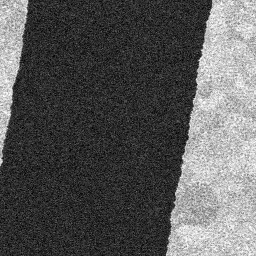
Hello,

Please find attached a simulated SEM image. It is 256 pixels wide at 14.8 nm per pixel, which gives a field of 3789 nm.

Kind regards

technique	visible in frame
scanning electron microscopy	one or a few lines or trenches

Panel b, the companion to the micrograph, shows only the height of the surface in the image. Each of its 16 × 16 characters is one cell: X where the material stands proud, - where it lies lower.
XX-----------XXX
XX-----------XXX
X------------XXX
X------------XXX
X-----------XXXX
X-----------XXXX
X-----------XXXX
X-----------XXXX
------------XXXX
------------XXXX
-----------XXXXX
-----------XXXXX
-----------XXXXX
-----------XXXXX
-----------XXXXX
----------XXXXXX